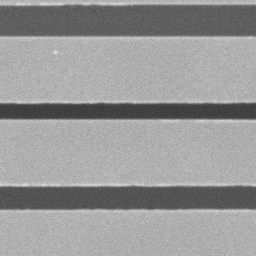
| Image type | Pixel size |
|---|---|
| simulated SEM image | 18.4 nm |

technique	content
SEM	lines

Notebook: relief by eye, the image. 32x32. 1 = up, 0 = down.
11111111001011110000000000000000
00000000000000000000000000000000
00000000000000000000000000000000
00000000000000000000000000000000
00000000000000000000000000000000
11111111111111111111111111111111
11111111111111111111111111111111
11111111111111111111111111111111
11111111111111111111111111111111
11111111111111111111111111111111
11111111111111111111111111111111
11111111111111111111111111111111
11111111111111111111111111111111
00000000000000000000000000000000
00000000000000000000000000000000
11111111111111111111111111111111
11111111111111111111111111111111
11111111111111111111111111111111
11111111111111111111111111111111
11111111111111111111111111111111
11111111111111111111111111111111
11111111111111111111111111111111
11111111111111111111111111111111
00000000000000000000000000000000
00000000000000000000000000000000
00000000000000000000000000000000
11111111111111111111111111111111
11111111111111111111111111111111
11111111111111111111111111111111
11111111111111111111111111111111
11111111111111111111111111111111
11111111111111111111111111111111